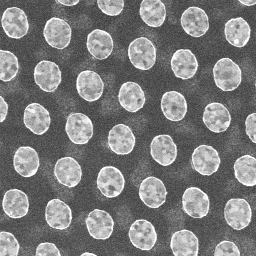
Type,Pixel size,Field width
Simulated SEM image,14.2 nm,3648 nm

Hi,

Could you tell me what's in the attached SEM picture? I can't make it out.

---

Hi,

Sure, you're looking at a regular array of raised bodies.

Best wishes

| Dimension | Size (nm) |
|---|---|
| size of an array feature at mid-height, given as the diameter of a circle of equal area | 398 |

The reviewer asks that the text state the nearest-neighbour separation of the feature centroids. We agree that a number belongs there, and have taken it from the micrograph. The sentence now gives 618 nm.